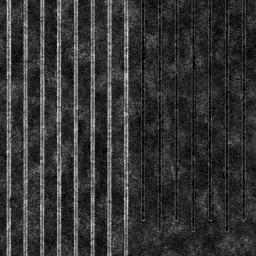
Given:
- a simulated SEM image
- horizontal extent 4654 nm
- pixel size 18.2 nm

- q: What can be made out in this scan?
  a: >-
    parallel lines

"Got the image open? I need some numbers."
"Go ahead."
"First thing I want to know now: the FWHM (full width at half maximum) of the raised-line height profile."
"52.3 nm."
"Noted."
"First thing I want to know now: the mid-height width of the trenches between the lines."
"255 nanometers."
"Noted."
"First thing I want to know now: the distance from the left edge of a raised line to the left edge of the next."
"0.305 micrometres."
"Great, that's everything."